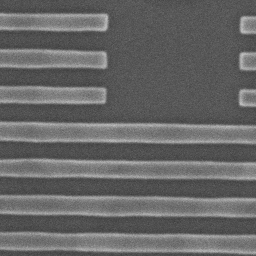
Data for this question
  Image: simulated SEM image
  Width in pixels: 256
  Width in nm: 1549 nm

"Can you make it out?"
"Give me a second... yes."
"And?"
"wiring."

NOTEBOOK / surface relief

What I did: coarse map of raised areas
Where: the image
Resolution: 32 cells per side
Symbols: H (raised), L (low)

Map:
LLLLLLLLLLLLLLLLLLLLLLLLLLLLLLLL
LLLLLLLLLLLLLLLLLLLLLLLLLLLLLLLL
HHHHHHHHHHHHHLLLLLLLLLLLLLLLLLHH
HHHHHHHHHHHHHLLLLLLLLLLLLLLLLLHH
LLLLLLLLLLLLLLLLLLLLLLLLLLLLLLLL
LLLLLLLLLLLLLLLLLLLLLLLLLLLLLLLL
HHHHHHHHHHLLLLLLLLLLLLLLLLLLLLLL
HHHHHHHHHHHHHLLLLLLLLLLLLLLLLLHH
LLLLLLLLLLLLLLLLLLLLLLLLLLLLLLHH
LLLLLLLLLLLLLLLLLLLLLLLLLLLLLLLL
LLLLLLLLLLLLLLLLLLLLLLLLLLLLLLLL
HHHHHHHHHHHHHLLLLLLLLLLLLLLLLLHH
HHHHHHHHHHHHHLLLLLLLLLLLLLLLLLHH
LLLLLLLLLLLLLLLLLLLLLLLLLLLLLLLL
LLLLLLLLLLLLLLLLLLLLLLLLLLLLLLLL
HHHHHHHHHHHLLLLLLLLLLLLLLLLLLLLL
HHHHHHHHHHHHHHHHHHHHHHHHHHHHHHHH
LHHHHHHHHHHHHHHHHHHHHHHHHHHHHHHH
LLLLLLLLLLLLLLLLLLLLLLLLLLLLLLLL
LLLLLLLLLLLLLLLLLLLLLLLLLLLLLLLL
HHHHHHHHHHHHHHHHHHHHHHHHHHHHHHHH
HHHHHHHHHHHHHHHHHHHHHHHHHHHHHHHH
LLLLLLLLLLLLLLLLLLLLLLLLLLLLLLLL
LLLLLLLLLLLLLLLLLLLLLLLLLLLLLLLL
LLLLLLLLLLLLLLLLLLLLLLLLLLLLLLLL
HHHHHHHHHHHHHHHHHHHHHHHHHHHHHHHH
HHHHHHHHHHHHHHHHHHHHHHHHHHHHHHHH
LLLLLLLLLLLLLLLLLLLLLLLLLLLLLLLL
LLLLLLLLLLLLLLLLLLLLLLLLLLLLLLLL
HHHHHHHHHHHHHHHHHHHHHHHHHHHHHHHH
HHHHHHHHHHHHHHHHHHHHHHHHHHHHHHHH
LLLLLLLLLLLLLLLLLLLLLLLLLLLLHHHH